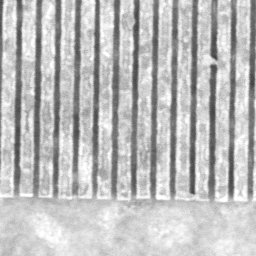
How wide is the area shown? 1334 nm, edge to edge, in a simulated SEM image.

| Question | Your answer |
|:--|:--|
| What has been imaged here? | parallel lines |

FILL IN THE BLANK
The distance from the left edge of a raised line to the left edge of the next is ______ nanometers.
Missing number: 102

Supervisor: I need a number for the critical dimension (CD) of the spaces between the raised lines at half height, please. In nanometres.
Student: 35.8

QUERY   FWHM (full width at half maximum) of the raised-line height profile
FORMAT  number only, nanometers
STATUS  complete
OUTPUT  67.1